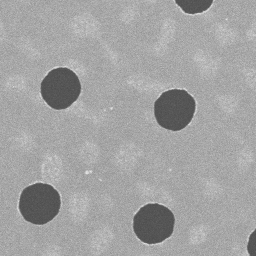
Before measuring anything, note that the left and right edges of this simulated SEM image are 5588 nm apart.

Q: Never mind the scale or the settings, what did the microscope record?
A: holes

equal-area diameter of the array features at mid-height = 908 nanometers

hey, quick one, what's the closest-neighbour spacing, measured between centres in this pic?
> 2530 nm